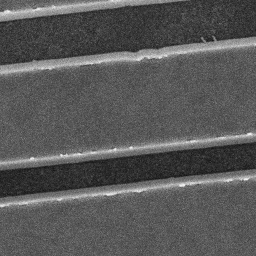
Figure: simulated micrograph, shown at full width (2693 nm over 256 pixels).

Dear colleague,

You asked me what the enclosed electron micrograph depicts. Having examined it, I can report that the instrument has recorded one or a few lines or trenches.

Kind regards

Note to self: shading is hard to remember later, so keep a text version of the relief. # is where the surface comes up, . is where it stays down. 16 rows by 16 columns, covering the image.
#####...........
................
................
.........#######
################
################
################
################
################
########........
................
..........######
.###############
################
################
################